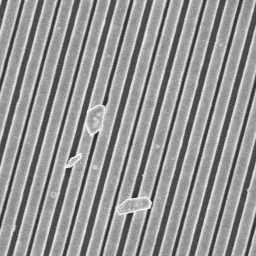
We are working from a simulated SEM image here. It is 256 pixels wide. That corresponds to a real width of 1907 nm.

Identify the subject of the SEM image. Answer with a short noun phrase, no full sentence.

parallel lines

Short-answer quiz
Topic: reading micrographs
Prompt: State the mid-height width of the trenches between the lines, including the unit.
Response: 0.045 micrometres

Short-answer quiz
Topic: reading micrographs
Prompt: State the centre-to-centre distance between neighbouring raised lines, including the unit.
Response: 131 nm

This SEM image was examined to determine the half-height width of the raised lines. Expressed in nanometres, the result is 89.2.